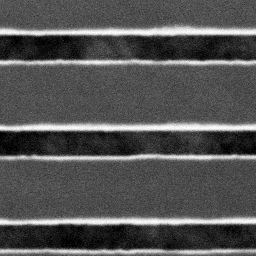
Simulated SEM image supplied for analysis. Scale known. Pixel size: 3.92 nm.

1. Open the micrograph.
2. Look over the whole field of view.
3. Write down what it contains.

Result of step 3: lines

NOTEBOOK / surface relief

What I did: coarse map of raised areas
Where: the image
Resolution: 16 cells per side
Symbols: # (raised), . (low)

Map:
################
################
................
................
################
################
################
################
................
................
################
################
################
################
................
................